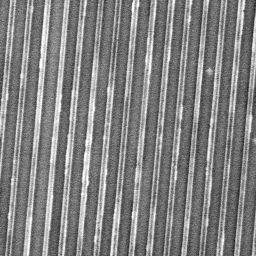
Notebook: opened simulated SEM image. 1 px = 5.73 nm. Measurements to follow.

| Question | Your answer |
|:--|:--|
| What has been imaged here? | parallel lines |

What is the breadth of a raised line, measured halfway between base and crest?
29.3 nm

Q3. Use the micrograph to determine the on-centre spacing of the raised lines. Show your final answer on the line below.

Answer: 100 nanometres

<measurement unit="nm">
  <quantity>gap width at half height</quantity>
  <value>69.2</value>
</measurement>